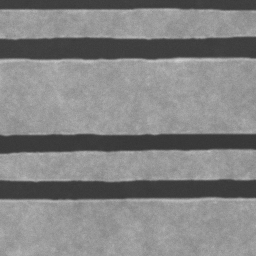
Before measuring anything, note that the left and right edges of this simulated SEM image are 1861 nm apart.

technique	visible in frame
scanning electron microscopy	lines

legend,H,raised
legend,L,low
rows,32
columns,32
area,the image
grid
LLLLLLLLLLLLLLLLLLLLLLLLLLLLLLLL
HHHHHHHHHHHHHHHHHHHHHHHHHHHHHHHH
HHHHHHHHHHHHHHHHHHHHHHHHHHHHHHHH
HHHHHHHHHHHHHHHHHHHHHHHHHHHHHHHH
HHHHHHHHHHHHHHHHHHHHHHHHHHHHHHHH
LLLLLLLLLLLLLLLLLLLLLLLLLLLLLLLL
LLLLLLLLLLLLLLLLLLLLLLLLLLLLLLLL
LHHHLLLLHLLLLLHHHHLHHHHHHHHHHHHH
HHHHHHHHHHHHHHHHHHHHHHHHHHHHHHHH
HHHHHHHHHHHHHHHHHHHHHHHHHHHHHHHH
HHHHHHHHHHHHHHHHHHHHHHHHHHHHHHHH
HHHHHHHHHHHHHHHHHHHHHHHHHHHHHHHH
HHHHHHHHHHHHHHHHHHHHHHHHHHHHHHHH
HHHHHHHHHHHHHHHHHHHHHHHHHHHHHHHH
HHHHHHHHHHHHHHHHHHHHHHHHHHHHHHHH
HHHHHHHHHHHHHHHHHHHHHHHHHHHHHHHH
HHHHHHHHHHHHHHHHHHHHHHHHHHHHHHHH
LLLLLLLLLLLLLLLLLLLLLLLLLLLLLLLL
LLLLLLLLLLLLLLLLLLLLLLLLLLLLLLLL
HHHHHHHHHHHHHHHHHHHHHHHHHHHHHHHH
HHHHHHHHHHHHHHHHHHHHHHHHHHHHHHHH
HHHHHHHHHHHHHHHHHHHHHHHHHHHHHHHH
LHHHHHHHHHHHHHHHHLHLLLLLLLLLLLLL
LLLLLLLLLLLLLLLLLLLLLLLLLLLLLLLL
LLLLLLLLLLLLLLLLLLLLLLLLLLLLLLLL
HHHHHHHHHHHHHHHHHHHHHHHHHHHHHHHH
HHHHHHHHHHHHHHHHHHHHHHHHHHHHHHHH
HHHHHHHHHHHHHHHHHHHHHHHHHHHHHHHH
HHHHHHHHHHHHHHHHHHHHHHHHHHHHHHHH
HHHHHHHHHHHHHHHHHHHHHHHHHHHHHHHH
HHHHHHHHHHHHHHHHHHHHHHHHHHHHHHHH
HHHHHHHHHHHHHHHHHHHHHHHHHHHHHHHH